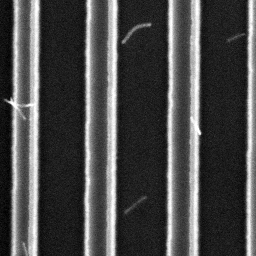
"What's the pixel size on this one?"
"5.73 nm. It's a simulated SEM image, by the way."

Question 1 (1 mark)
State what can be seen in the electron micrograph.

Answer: lines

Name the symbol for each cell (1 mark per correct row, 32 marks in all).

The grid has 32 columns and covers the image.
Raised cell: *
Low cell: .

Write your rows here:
..***......***........***......*
..***......***.......****......*
..***......***.......****......*
..**.......***.......****......*
..***......***.......****......*
..**.......***.......****......*
..**.......***.......****......*
..**.......***.......****......*
..**.......***........***......*
..**.......***........***......*
..**.......***........***......*
..**.......***.......****......*
..**.......***.......****......*
..**.......***.......****......*
..**.......***.......***.......*
..**.......***.......****......*
..**.......***.......****......*
..**.......***.......***.......*
..**.......***.......***.......*
..**.......***.......***.......*
..**.......***.......***.......*
..**.......***.......***.......*
..**.......***.......***.......*
..**.......***.......***.......*
..**.......***.......***.......*
..**.......***.......***.......*
..**.......***.......***.......*
..**.......***.......***.......*
..**.......***.......***.......*
..**.......***.......***.......*
..**.......***.......***.......*
..**.......***.......***.......*